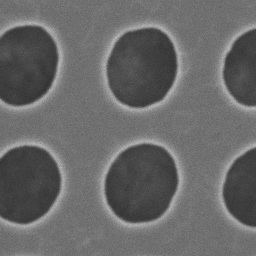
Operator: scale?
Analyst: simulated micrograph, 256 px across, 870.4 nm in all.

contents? holes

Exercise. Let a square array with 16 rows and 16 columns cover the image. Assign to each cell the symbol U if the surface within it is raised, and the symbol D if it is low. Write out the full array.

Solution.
UUUUUUUUUUUUUUUU
UUUUUUUUUUUUUUUU
DDDUUUUDDDDUUUUD
DDDDUUUDDDDUUUDD
DDDDUUUDDDDUUUDD
DDDUUUUDDDDUUUDD
UDUUUUUUDDUUUUUD
UUUUUUUUUUUUUUUU
UUUUUUUUUUUUUUUU
DDDUUUUUDDUUUUUD
DDDDUUUDDDDUUUDD
DDDDUUUDDDDUUUDD
DDDDUUUDDDDUUUDD
DDDUUUUDDDUUUUUD
UUUUUUUUUUUUUUUU
UUUUUUUUUUUUUUUU